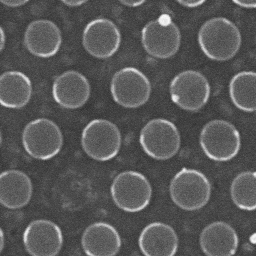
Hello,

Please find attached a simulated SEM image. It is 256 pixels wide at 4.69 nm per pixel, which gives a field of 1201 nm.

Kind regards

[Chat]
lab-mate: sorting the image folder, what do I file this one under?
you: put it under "a regular array of raised bodies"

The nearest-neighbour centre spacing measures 270 nanometres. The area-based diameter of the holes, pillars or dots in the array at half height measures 0.181 micrometres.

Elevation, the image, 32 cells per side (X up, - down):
-XX------X------X------XX-----XX
--------------------------------
--------------------X-----XX----
----XXX----XXX----XXXX---XXXX---
---XXXXX---XXXX---XXXX---XXXXX--
---XXXX----XXXX---XXXX---XXXXX--
----XXX----XXX-----XXX----XXX---
--------------------------------
--------------------------------
XXX-----XX----XXXX----XXX-----XX
XXXX---XXXX---XXXXX---XXXX---XXX
XXXX---XXXX---XXXXX---XXXX---XXX
XXX----XXXX----XXX----XXXX---XXX
-----------------------XX-----XX
--------------------------------
----XXX----XXX-----XX-----XXX---
---XXXX---XXXXX---XXXX---XXXXX--
---XXXXX--XXXXX---XXXX---XXXXX--
---XXXX----XXXX---XXXX---XXXXX--
----XX-----XXX-----XX-----XXX---
--------------------------------
-X---------------------XX-------
XXXX----------XXXX----XXXX---XXX
XXXX----------XXXXX--XXXXX---XXX
XXXX----------XXXXX---XXXX---XXX
XXX------------XXX----XXX-----XX
--------------------------------
--------------------------------
---XXXX----XXX----XXX-----XXX---
---XXXXX--XXXXX---XXXX---XXXX---
---XXXXX--XXXXX--XXXXX---XXXXX--
----XXX----XXX----XXXX----XXX---